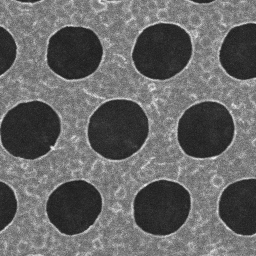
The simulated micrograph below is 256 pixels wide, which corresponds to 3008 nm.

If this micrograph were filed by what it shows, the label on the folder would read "holes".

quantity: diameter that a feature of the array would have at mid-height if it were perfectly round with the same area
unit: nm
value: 674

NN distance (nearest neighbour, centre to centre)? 1.03 um